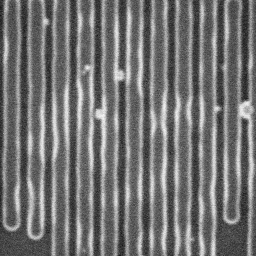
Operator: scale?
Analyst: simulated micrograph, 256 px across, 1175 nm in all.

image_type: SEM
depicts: groups of lines, slits or small figures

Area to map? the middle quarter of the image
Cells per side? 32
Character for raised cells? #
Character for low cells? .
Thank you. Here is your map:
#...###...###...###...####..####
#...###...###...###...####..####
#...###...###...###...####..####
#...###...###...###...####..####
#...###...###...###...####..####
#...###...###...###...####..####
#...###...###...###...####..####
#...###...###...###...###...####
#...###...###...####..###...####
#...###...###...####..###....###
#...###...###...####..###....##.
#...###...###...####..###...###.
#...###..####...####..###...###.
#...###...###...###...###...####
#...###...###...###...###...####
#...###...###...###...###...####
#...###...###...###...###...####
#...###...###...###...###...####
#...###...###...###...###...####
#...###...###...###...###...####
#...###...###...###...###...####
#...###...###...###...###...####
#...###...###...###...###...####
#...###...###...###...###...####
#..####...###...###...###...####
#..####...###...###...###...####
#..####...###...###...###...####
#..####...###...###...###...####
#...###...###...###...###...####
#...###...###...###...###...####
#...###...###...###...###...####
#..####...###...###...###...####